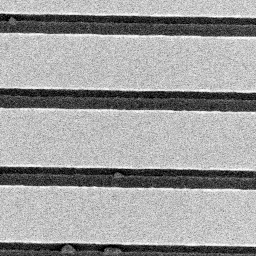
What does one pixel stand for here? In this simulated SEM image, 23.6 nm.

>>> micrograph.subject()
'lines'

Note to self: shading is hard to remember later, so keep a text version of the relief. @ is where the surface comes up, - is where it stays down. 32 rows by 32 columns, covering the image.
@@@@@@@@@@@@@@@@@@@@@@@@@@@@@@@@
@@@@@@@@@@@@@@@@@@@@@@@@@@@@@@@@
--------------------------------
--------------------------------
@@@@@@@@@@@@@@@@@@@@@-----------
@@@@@@@@@@@@@@@@@@@@@@@@@@@@@@@@
@@@@@@@@@@@@@@@@@@@@@@@@@@@@@@@@
@@@@@@@@@@@@@@@@@@@@@@@@@@@@@@@@
@@@@@@@@@@@@@@@@@@@@@@@@@@@@@@@@
@@@@@@@@@@@@@@@@@@@@@@@@@@@@@@@@
@@@@@@@@@@@@@@@@@@@@@@@@@@@@@@@@
--------------------------------
--------------------------------
--------------------------------
@@@@@@@@@@@@@@@@@@@@@@@@@@@@@@@@
@@@@@@@@@@@@@@@@@@@@@@@@@@@@@@@@
@@@@@@@@@@@@@@@@@@@@@@@@@@@@@@@@
@@@@@@@@@@@@@@@@@@@@@@@@@@@@@@@@
@@@@@@@@@@@@@@@@@@@@@@@@@@@@@@@@
@@@@@@@@@@@@@@@@@@@@@@@@@@@@@@@@
@@@@@@@@@@@@@@@@@@@@@@@@@@@@@@@@
--------------------------------
--------------------------------
@@@@@@@@@@@@@@@@--@@------------
@@@@@@@@@@@@@@@@@@@@@@@@@@@@@@@@
@@@@@@@@@@@@@@@@@@@@@@@@@@@@@@@@
@@@@@@@@@@@@@@@@@@@@@@@@@@@@@@@@
@@@@@@@@@@@@@@@@@@@@@@@@@@@@@@@@
@@@@@@@@@@@@@@@@@@@@@@@@@@@@@@@@
@@@@@@@@@@@@@@@@@@@@@@@@@@@@@@@@
---------------@@@@@@@@@@@@@@@@@
--------------------------------